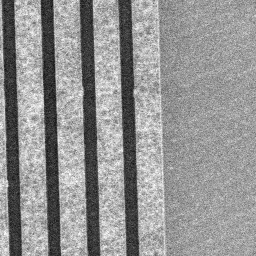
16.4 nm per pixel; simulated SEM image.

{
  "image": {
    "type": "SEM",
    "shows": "parallel lines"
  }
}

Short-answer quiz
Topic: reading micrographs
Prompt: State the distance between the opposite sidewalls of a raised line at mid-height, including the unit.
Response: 426 nm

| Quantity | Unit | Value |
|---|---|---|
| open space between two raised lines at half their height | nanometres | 213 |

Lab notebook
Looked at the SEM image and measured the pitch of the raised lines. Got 39 pixels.